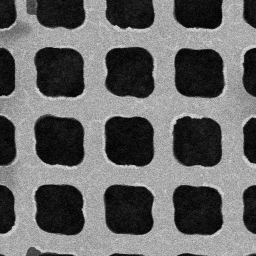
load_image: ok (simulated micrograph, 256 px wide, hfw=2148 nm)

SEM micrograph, a regular array of holes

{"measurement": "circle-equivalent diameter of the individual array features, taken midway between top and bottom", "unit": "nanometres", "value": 442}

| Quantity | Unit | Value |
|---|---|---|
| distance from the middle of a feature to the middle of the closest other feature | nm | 574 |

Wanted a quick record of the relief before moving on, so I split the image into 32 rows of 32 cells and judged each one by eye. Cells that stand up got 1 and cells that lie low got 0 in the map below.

00100000000110000001110000001100
00110000000110000001110000001100
00111000000110000001110000001110
01111111111111100011111110011111
11111111111111111111111111111111
11111111111111111111111111111111
01111000001111000011110000011110
00110000001110000001110000001100
00110000001110000001110000001100
00111000001110000001110000001100
00111000001110000001110000001100
01111000001111000001110000001110
11111111111111111111111111111111
11111111111111111111111111111111
11111101111111111111111111111111
00110000001110000001110000011110
00110000001110000001110000001100
00110000001110000001110000001100
00110000001110000001110000001100
00111000001110000001110000001110
01111100001111100011111000011111
11111111111111111111111111111111
11111111111111111111111111111111
01111000011110000011110000111110
00110000001110000001110000001100
00111000001110000001110000001100
00111000001110000001110000001100
00111000000110000001110000001100
01111000001111000001110000001110
11111111111111111111111111111111
11111111111111111111111111111111
11100111111111111111111111111111